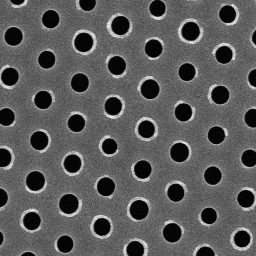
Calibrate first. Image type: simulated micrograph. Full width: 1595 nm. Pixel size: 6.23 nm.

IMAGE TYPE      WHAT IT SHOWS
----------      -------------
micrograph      a regular array of holes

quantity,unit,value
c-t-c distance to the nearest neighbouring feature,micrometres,0.251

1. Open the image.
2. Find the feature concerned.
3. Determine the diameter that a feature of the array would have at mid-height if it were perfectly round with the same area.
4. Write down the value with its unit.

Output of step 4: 111 nanometres